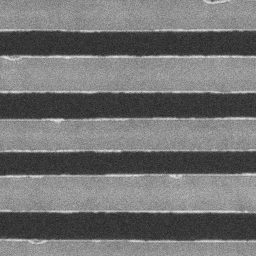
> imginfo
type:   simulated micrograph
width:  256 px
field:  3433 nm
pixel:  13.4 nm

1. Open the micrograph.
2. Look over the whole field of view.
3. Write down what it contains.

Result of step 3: lines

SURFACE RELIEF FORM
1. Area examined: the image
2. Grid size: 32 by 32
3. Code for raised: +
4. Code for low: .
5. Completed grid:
................................
................................
................................
................................
++++++++++++++++++++++++++++++++
++++++++++++++++++++++++++++++++
++++++++++++++++++++++++++++++++
................................
................................
................................
................................
................................
++++++++++++++++++++++++++++++++
++++++++++++++++++++++++++++++++
++++++++++++++++++++++++++++++++
................................
................................
................................
................................
++++++++++++++++++++++++++++++++
++++++++++++++++++++++++++++++++
++++++++++++++++++++++++++++++++
................................
................................
................................
................................
++++++++++++++++++++++++++++++..
++++++++++++++++++++++++++++++++
++++++++++++++++++++++++++++++++
++++++++++++++++++++++++++++++++
................................
................................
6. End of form